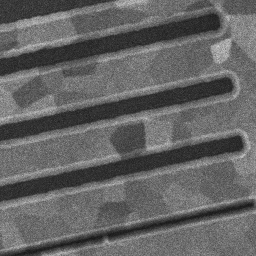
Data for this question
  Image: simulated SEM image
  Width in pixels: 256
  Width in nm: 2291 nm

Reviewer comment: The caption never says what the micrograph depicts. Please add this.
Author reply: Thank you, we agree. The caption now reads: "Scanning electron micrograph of one or a few lines or trenches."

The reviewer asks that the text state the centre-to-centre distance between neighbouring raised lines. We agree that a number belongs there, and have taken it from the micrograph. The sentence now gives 61.9 px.